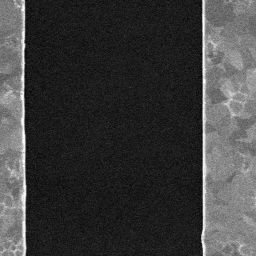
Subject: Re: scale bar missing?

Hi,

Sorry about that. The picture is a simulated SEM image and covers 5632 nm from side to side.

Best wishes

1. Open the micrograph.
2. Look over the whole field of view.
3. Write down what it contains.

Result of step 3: one or a few lines or trenches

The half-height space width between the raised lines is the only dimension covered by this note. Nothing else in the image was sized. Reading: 179 px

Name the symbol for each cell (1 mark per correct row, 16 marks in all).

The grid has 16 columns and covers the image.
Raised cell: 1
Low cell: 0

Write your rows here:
1000000000000111
1000000000000111
1000000000000111
1000000000000111
1000000000000111
1000000000000111
1000000000000111
1000000000000111
1000000000000111
1000000000000111
1100000000000111
1100000000000111
1100000000000111
1100000000000111
1100000000000111
1100000000000111